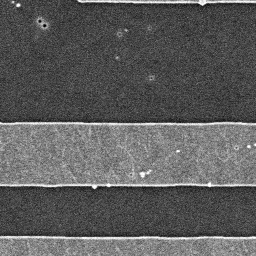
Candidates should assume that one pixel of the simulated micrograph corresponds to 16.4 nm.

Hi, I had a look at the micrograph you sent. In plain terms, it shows wiring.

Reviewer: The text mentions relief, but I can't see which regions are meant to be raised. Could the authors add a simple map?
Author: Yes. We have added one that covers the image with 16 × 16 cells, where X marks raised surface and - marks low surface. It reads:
----------------
----------------
----------------
----------------
----------------
----------------
----------------
----------------
XXXXXXXXXXXXXXXX
XXXXXXXXXXXXXXXX
XXXXXXXXXXXXXXXX
XXXXXXXXXXXXXXXX
----------------
----------------
----------------
XXXXXXXXXXXXXXXX